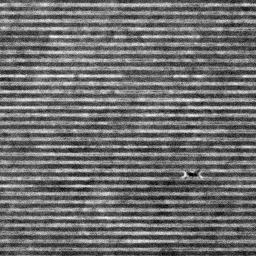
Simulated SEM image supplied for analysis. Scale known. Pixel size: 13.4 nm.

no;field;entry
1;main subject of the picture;parallel lines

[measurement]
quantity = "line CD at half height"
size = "28.6 nm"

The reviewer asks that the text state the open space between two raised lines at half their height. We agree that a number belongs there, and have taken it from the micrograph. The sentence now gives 79 nanometres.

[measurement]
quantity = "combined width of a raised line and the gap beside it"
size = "106 nanometres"